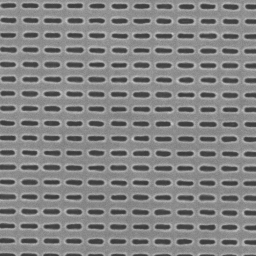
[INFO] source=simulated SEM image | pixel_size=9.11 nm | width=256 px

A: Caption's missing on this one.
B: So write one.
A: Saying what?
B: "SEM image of a regular array of holes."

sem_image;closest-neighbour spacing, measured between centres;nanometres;133